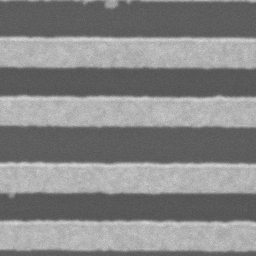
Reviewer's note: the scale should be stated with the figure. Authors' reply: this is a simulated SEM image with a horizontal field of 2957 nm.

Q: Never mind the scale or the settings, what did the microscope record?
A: lines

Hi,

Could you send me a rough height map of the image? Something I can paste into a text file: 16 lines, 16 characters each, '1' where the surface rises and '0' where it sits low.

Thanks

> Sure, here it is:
0000000000000000
0000000000000000
1111111111111111
1111111111111111
0000000000000000
0000000000000000
1111111111111111
1111111111111111
0000000000000000
0000000000000000
1111111111111111
1111111111111111
0000000000000000
0000000000000000
1111111111111111
1111111111111111